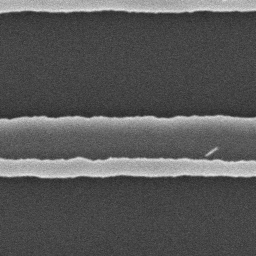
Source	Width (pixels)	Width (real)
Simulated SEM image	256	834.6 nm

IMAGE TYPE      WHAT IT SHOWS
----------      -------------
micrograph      lines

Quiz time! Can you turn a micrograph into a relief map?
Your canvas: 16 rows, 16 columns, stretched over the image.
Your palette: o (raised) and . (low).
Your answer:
oooooooooooooooo
................
................
................
................
................
................
oooooooooooooooo
oooooooooooooooo
oooooooooooooooo
oooooooooooooooo
................
................
................
................
................